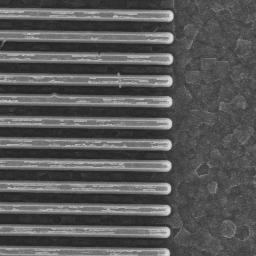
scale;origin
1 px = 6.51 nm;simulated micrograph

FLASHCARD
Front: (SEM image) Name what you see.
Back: parallel lines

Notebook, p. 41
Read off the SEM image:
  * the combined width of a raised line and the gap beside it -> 141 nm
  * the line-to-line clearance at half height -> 85.4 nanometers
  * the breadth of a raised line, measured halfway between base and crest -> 54.5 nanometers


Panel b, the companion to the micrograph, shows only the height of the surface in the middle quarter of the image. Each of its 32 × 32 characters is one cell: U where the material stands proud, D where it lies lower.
DDDDDDDDDDDDDDDDDDDDDDDDDDDDDDDD
DDDDDDDDDDDDDDDDDDDDDDDDDDDDDDDD
DDDDDDDDDDDDDDDDDDDDDDDDDDDDDDDD
UUUUUUUUUUUUUUUUUUUUUUUUUUDDDDDD
UUUUUUUUUUUUUUUUUUUUUUUUUUUDDDDD
DDDDDDDDDDDDDDDDDDDDDDDDDDDDDDDD
DDDDDDDDDDDDDDDDDDDDDDDDDDDDDDDD
DDDDDDDDDDDDDDDDDDDDDDDDDDDDDDDD
UUUUUUUUUUUUUUUUUUUUUUDDDDDDDDDD
UUUUUUUUUUUUUUUUUUUUUUUUUUUDDDDD
DDDDDDDDDDDDDDDDDDDDDDDDDDDDDDDD
DDDDDDDDDDDDDDDDDDDDDDDDDDDDDDDD
DDDDDDDDDDDDDDDDDDDDDDDDDDDDDDDD
DDDDDDDDDDDDDDDDDDDDDDDDDDDDDDDD
UUUUUUUUUUUUUUUUUUUUUUUUUUDDDDDD
DDDUUUUUUUUUUUUUUUUUUUUUUUDDDDDD
DDDDDDDDDDDDDDDDDDDDDDDDDDDDDDDD
DDDDDDDDDDDDDDDDDDDDDDDDDDDDDDDD
DDDDDDDDDDDDDDDDDDDDDDDDDDDDDDDD
UUUUUUUUUUUUUUUUUUUUUUUUUUDDDDDD
UUUUUUUUUUUUUUUUUUUUUUUUUUDDDDDD
DDDDDDDDDDDDDDDDDDDDDDDDDDDDDDDD
DDDDDDDDDDDDDDDDDDDDDDDDDDDDDDDD
DDDDDDDDDDDDDDDDDDDDDDDDDDDDDDDD
UUUUUUUUUUUUUUUUUUUUUUUUUUDDDDDD
UUUUUUUUUUUUUUUUUUUUUUUUUUDDDDDD
DDDDDDDDDDDDDDDDDDDUUDDUUUDDDDDD
DDDDDDDDDDDDDDDDDDDDDDDDDDDDDDDD
DDDDDDDDDDDDDDDDDDDDDDDDDDDDDDDD
DDDDDDDDDDDDDDDDDDDDDDDDDDDDDDDD
UUUUUUUUUUUUUUUUUUUUUUUUUUDDDDDD
UUUUUUUUUUUUUUUUUUUUUUUUUUDDDDDD